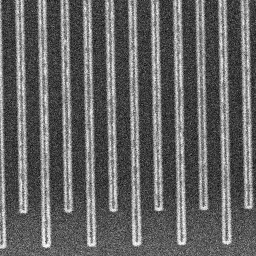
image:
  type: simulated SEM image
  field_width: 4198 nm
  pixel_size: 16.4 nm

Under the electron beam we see parallel lines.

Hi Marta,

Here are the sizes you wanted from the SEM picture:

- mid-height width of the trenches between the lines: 266 nm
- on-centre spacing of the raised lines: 370 nm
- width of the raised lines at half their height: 98.4 nm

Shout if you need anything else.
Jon